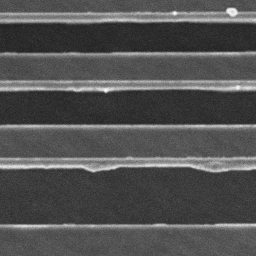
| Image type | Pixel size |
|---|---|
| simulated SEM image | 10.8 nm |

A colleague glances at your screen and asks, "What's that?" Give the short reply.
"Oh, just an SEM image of lines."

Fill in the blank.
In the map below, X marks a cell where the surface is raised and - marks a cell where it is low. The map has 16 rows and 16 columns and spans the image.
XXXXXXXXXXXXXXXX
----------------
----------------
XXXXXXXXXXXXXXXX
XXXXXXXXXXXXXXXX
XXXXXXXXXXXXXXXX
----------------
----------------
XXXXXXXXXXXXXXXX
XXXXXXXXXXXXXXXX
-----XX-----XXXX
----------------
----------------
----------------
XXXXXXXXXXXXXXXX
XXXXXXXXXXXXXXXX